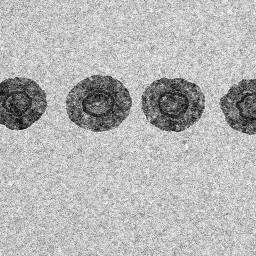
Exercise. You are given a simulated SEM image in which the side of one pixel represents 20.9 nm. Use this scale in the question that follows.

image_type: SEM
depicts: ring-shaped grooves with a dot in the middle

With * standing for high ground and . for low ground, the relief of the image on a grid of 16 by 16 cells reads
****************
****************
****************
****************
****************
...**...*...**..
...*....*....*..
..**....*...**..
****************
****************
****************
****************
****************
****************
****************
****************